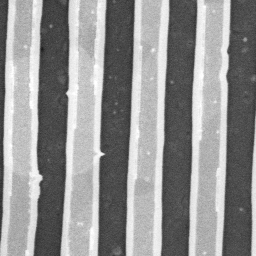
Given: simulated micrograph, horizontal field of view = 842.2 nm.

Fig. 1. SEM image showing one or a few lines or trenches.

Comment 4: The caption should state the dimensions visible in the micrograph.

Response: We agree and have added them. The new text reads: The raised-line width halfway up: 0.0899 um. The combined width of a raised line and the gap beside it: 206 nanometres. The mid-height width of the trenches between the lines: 0.115 micrometres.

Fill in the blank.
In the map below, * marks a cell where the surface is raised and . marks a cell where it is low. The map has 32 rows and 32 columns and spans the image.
..***....****....****....***....
.****....****....****....***....
.****....****....****....***....
.****....****....***.....***....
.****....****....***.....***....
.***.....****....***.....***....
.***.....***.....***.....***....
.***.....***.....***.....***....
.***.....***.....***.....***....
.***.....***.....***.....***....
.***.....***.....***.....***....
.***.....***.....***.....***....
.***.....***.....***.....***....
.***.....***.....***.....***....
.***.....***.....***....****....
.***.....***.....***.....***....
.***.....***.....***.....***....
.***.....***.....***....****....
.***.....***.....***.....***....
.***.....***.....***.....***....
.***.....***....****.....***....
.***.....***....****....****....
.****....***....****....****....
.***.....***....****....****....
.***.....***....****....****....
.***....****....****....****....
.***....****....****....****....
.***....****....****....***.....
.***....****....****....***.....
.***....****....****....***.....
.***....****....****....***.....
****....****....****....***.....